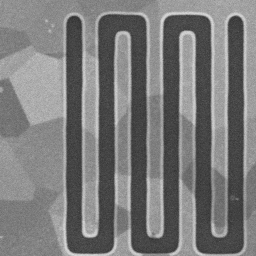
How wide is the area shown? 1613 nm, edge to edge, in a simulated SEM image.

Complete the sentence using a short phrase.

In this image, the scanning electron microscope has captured groups of lines, slits or small figures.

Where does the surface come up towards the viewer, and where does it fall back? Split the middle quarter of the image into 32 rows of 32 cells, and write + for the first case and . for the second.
.....+++.....+++.....+++.....+++
.....+++.....+++.....+++.....+++
.....+++.....+++.....+++.....+++
.....+++.....+++.....+++.....+++
.....+++.....+++.....+++.....+++
.....+++.....+++.....+++.....+++
.....+++.....+++.....+++.....+++
.....+++.....+++.....+++.....+++
.....+++.....+++.....+++.....+++
.....+++.....+++.....+++.....+++
.....+++.....+++.....+++.....+++
.....+++.....+++.....+++.....+++
.....+++.....+++.....+++.....+++
.....+++.....+++.....+++.....+++
.....+++.....+++.....+++.....+++
.....+++.....+++.....+++.....+++
.....+++.....+++.....+++.....+++
.....+++.....+++.....+++.....+++
.....+++.....+++.....+++.....+++
.....+++.....+++.....+++.....+++
.....+++.....+++.....+++.....+++
.....+++.....+++.....+++.....+++
.....+++.....+++.....+++.....+++
.....+++.....+++.....+++.....+++
.....+++.....+++.....+++.....+++
.....+++.....+++.....+++.....+++
.....+++.....+++.....+++.....+++
.....+++.....+++.....+++.....+++
.....+++.....+++.....+++.....+++
.....+++.....+++.....+++.....+++
.....+++.....+++.....+++.....+++
.....+++.....+++.....+++.....+++